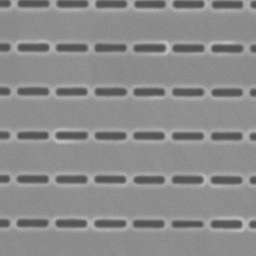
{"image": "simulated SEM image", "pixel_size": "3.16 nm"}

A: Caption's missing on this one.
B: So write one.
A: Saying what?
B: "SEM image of a regular array of holes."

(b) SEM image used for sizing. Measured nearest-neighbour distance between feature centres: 122 nm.